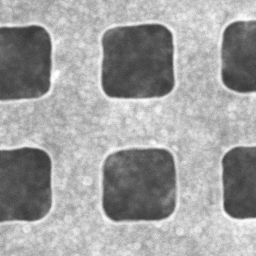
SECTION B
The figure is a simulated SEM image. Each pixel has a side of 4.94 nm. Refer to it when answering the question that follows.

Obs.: holes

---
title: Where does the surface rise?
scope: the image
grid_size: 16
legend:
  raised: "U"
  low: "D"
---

UUUUUUUUUUUUUUUU
UUUUUUUUUDUUUUDD
DDDUUUDDDDDUUUDD
DDDUUUDDDDDUUUDD
DDDUUUDDDDDUUUDD
DDDUUUDDDDDUUUDD
UUUUUUUUUUUUUUUU
UUUUUUUUUUUUUUUU
UUUUUUUUUUUUUUUU
DDDUUUUDDDDUUUDD
DDDUUUDDDDDUUUDD
DDDUUUDDDDDUUUDD
DDDUUUDDDDDUUUDD
DDDUUUUDDDDUUUDD
UUUUUUUUUUUUUUUU
UUUUUUUUUUUUUUUU